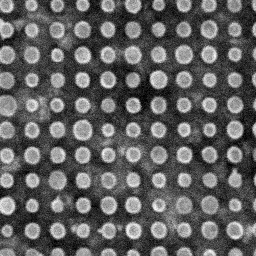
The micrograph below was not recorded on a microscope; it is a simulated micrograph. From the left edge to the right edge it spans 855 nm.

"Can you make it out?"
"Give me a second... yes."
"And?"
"a regular array of raised bodies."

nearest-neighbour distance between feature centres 83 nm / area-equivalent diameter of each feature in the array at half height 48.6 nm